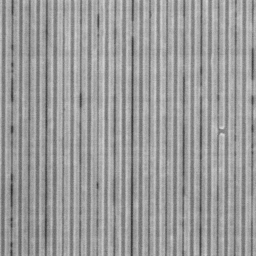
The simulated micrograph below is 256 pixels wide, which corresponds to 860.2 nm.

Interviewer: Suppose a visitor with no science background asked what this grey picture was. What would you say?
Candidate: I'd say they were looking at parallel lines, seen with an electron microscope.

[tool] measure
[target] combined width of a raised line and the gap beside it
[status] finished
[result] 28.8 nm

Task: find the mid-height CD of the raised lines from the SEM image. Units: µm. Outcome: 0.0185